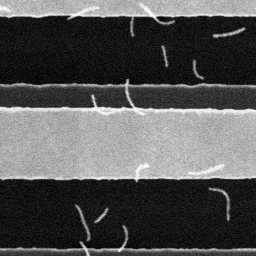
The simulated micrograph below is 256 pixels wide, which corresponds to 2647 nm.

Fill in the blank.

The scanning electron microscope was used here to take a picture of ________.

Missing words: lines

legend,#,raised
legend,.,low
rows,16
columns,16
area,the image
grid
################
................
................
................
................
################
################
################
################
################
################
................
................
................
................
................